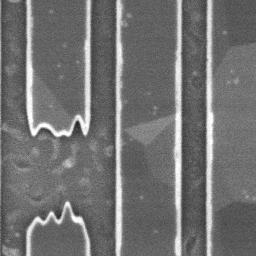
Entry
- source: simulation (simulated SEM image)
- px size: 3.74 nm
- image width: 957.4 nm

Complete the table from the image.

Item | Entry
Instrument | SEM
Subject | one or a few lines or trenches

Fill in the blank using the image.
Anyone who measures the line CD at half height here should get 229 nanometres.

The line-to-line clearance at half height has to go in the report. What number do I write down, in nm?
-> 109